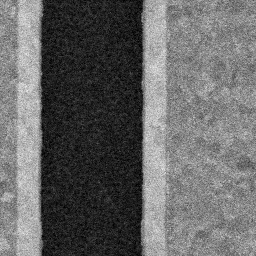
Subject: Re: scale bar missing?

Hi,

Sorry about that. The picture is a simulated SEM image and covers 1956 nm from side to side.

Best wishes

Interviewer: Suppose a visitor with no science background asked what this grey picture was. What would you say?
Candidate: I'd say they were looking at one or a few lines or trenches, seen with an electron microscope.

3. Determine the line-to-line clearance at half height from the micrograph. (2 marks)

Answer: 0.966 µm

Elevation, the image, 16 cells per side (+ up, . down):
++........++++++
++........++++++
++........++++++
++........++++++
++........++++++
++........++++++
++........++++++
++........++++++
++........++++++
++........++++++
++........++++++
++........++++++
++........++++++
++........++++++
++........++++++
++........++++++